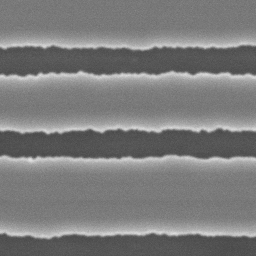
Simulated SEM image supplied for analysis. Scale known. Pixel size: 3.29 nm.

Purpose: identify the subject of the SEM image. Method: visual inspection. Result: lines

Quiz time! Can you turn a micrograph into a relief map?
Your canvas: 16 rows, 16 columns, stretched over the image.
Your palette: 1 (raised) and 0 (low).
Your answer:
1111111111111111
1111111111111111
1111111111111111
0000000000000000
0000000000000000
1111111111111111
1111111111111111
1111111111111111
0000000000000000
0000000000000000
1111111111111111
1111111111111111
1111111111111111
1111111111111111
1111111111111111
0000000000000000